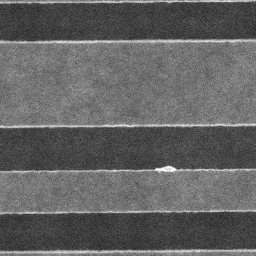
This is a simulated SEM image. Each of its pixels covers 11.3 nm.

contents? lines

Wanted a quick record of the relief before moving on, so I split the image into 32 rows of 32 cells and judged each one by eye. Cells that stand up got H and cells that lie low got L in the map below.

LLLLLLLLLLLLLLLLLLLLLLLLLLLLLLLL
LLLLLLLLLLLLLLLLLLLLLLLLLLLLLLLL
LLLLLLLLLLLLLLLLLLLLLLLLLLLLLLLL
LLLLLLLLLLLLLLLLLLLLLLLLLLLLLLLL
LLLLLLLLLLLLLLLLLLLLLLLLLLLLLLLL
HHHHHHHHHHHHHHHHHHHHHHHHHHHHHHHH
HHHHHHHHHHHHHHHHHHHHHHHHHHHHHHHH
HHHHHHHHHHHHHHHHHHHHHHHHHHHHHHHH
HHHHHHHHHHHHHHHHHHHHHHHHHHHHHHHH
HHHHHHHHHHHHHHHHHHHHHHHHHHHHHHHH
HHHHHHHHHHHHHHHHHHHHHHHHHHHHHHHH
HHHHHHHHHHHHHHHHHHHHHHHHHHHHHHHH
HHHHHHHHHHHHHHHHHHHHHHHHHHHHHHHH
HHHHHHHHHHHHHHHHHHHHHHHHHHHHHHHH
HHHHHHHHHHHHHHHHHHHHHHHHHHHHHHHH
HHHHHHHHHHHHHHHHHHHHHHHHHHHHHHHH
LLLLLLLLLLLLLLLLLLLLLLLLLLLLLLLL
LLLLLLLLLLLLLLLLLLLLLLLLLLLLLLLL
LLLLLLLLLLLLLLLLLLLLLLLLLLLLLLLL
LLLLLLLLLLLLLLLLLLLLLLLLLLLLLLLL
LLLLLLLLLLLLLLLLLLLLLLLLLLLLLLLL
HHHHHHHHHHHHHHHHHHHHHHHHHHHHHHHH
HHHHHHHHHHHHHHHHHHHHHHHHHHHHHHHH
HHHHHHHHHHHHHHHHHHHHHHHHHHHHHHHH
HHHHHHHHHHHHHHHHHHHHHHHHHHHHHHHH
HHHHHHHHHHHHHHHHHHHHHHHHHHHHHHHH
HHHHHHHHHHHHHHHHHLLLLLLLLLLLLLLL
LLLLLLLLLLLLLLLLLLLLLLLLLLLLLLLL
LLLLLLLLLLLLLLLLLLLLLLLLLLLLLLLL
LLLLLLLLLLLLLLLLLLLLLLLLLLLLLLLL
LLLLLLLLLLLLLLLLLLLLLLLLLLLLLLLL
LLLLLLLHLHHHHHHHHHHHHHHHHHHHHHHH